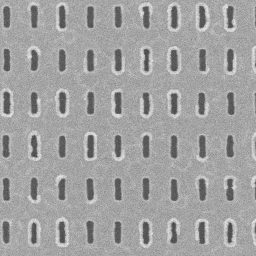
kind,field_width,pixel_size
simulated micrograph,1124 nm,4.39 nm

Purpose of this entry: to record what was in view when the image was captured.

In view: a regular array of holes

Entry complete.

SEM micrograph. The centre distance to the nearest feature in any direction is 122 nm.